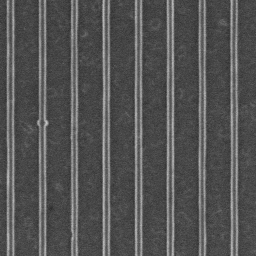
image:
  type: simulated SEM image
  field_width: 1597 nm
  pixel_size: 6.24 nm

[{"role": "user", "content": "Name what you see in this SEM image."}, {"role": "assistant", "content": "parallel lines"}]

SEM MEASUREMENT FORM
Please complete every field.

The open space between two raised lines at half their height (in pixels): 25.9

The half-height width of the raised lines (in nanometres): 34.3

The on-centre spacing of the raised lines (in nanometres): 200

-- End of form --